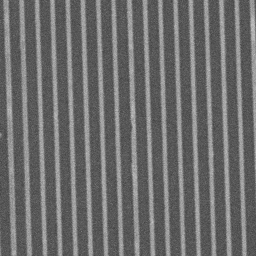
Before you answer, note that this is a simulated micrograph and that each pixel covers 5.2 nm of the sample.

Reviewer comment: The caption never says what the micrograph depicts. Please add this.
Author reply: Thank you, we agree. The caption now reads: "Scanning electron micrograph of parallel lines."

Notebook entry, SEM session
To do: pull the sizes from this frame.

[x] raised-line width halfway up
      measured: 18.8 nanometers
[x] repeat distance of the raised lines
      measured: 79.9 nm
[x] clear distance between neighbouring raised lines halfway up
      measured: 0.0611 micrometres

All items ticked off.